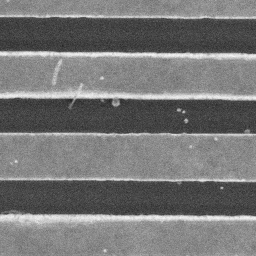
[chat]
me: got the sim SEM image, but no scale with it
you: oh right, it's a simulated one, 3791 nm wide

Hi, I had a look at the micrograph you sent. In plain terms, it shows lines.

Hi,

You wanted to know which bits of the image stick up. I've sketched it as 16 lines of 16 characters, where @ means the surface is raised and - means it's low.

@@@@@@@@@@@@@@@@
----------------
----------------
@@@@@@@@@@@@@@@@
@@@@@@@@@@@@@@@@
@@@@@@@@@@@@@@@@
----------------
----------------
@@@@@@@@@@@@@@@@
@@@@@@@@@@@@@@@@
@@@@@@@@@@@@@@@@
----------------
----------------
@@@@------------
@@@@@@@@@@@@@@@@
@@@@@@@@@@@@@@@@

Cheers